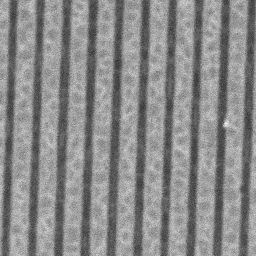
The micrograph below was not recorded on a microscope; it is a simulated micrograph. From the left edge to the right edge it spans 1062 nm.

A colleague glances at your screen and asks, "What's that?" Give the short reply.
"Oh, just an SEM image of parallel lines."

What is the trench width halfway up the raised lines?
42.5 nm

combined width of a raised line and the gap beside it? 110 nm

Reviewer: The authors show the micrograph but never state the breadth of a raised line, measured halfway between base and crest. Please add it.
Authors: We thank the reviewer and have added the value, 67.4 nm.